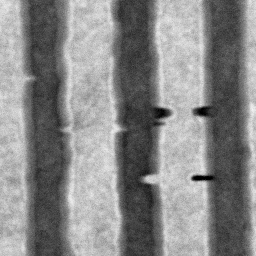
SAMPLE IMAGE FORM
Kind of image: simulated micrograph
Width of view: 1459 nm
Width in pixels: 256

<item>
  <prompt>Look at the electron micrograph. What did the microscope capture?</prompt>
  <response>one or a few lines or trenches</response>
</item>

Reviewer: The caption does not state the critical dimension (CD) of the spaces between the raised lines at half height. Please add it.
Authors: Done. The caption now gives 217 nanometers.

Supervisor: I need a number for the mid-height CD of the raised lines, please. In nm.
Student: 295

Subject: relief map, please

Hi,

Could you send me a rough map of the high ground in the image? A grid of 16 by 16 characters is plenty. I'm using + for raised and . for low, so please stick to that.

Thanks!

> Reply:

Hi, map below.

+...+++...+++..+
++..+++...+++..+
++..+++...+++..+
++..+++...+++..+
++..+++...+++..+
++..+++...+++..+
++..+++...+++..+
++..+++...+++..+
++..+++...+++..+
++..+++...+++...
++..+++...+++..+
++..+++..++++..+
++..++++..+++...
++..++++..+++...
++..++++..+++...
++..++++..+++...